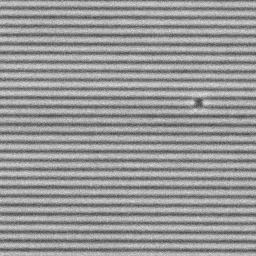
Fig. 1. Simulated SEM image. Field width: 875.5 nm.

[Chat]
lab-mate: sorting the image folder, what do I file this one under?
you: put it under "parallel lines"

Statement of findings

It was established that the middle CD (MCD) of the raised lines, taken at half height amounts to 17.9 nm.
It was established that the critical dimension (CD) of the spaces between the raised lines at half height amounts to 12 nanometers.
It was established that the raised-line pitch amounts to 0.0306 micrometres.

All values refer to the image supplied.